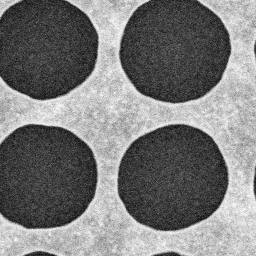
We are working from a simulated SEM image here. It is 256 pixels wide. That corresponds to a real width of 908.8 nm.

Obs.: holes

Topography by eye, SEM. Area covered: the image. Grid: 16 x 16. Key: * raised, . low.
*....****....***
......**......**
......**......**
......*.......**
......**......**
*....***.....***
****************
****************
.....****....***
......**......**
......*.......**
......*.......**
......**......**
.....***.....***
****************
****************